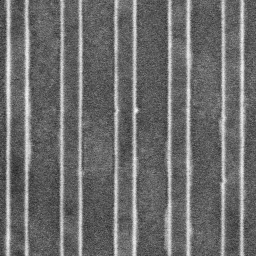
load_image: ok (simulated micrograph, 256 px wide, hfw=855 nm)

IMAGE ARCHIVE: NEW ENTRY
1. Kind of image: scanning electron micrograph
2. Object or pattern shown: parallel lines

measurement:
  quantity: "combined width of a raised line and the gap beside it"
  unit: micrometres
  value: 0.179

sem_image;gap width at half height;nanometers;113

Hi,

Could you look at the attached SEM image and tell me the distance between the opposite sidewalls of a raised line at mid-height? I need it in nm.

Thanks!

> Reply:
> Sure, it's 64.6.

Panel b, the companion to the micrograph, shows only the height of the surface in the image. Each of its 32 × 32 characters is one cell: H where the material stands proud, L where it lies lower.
LHHLLLLLHHLLLLHHHLLLLHHHLLLLHHLL
LHHLLLLLHHLLLLHHHLLLLHHHLLLLHHLL
LHHLLLLLHHLLLLHHHLLLLHHHLLLLHHLL
LHHLLLLLHHLLLLHHHLLLLHHHLLLLHHLL
LHHLLLLLHHLLLLHHHLLLLHHHLLLLHHLL
LHHLLLLLHHLLLLHHHLLLLHHHLLLLHHLL
LHHLLLLLHHLLLLHHHLLLLHHHLLLLHHLL
LHHLLLLLHHLLLLHHHLLLLHHHLLLLHHLL
LHHLLLLLHHLLLLHHHLLLLHHHLLLLHHLL
LHHLLLLLHHLLLLHHHLLLLHHHLLLLHHLL
LHHLLLLLHHLLLLHHHLLLLHHHLLLLHHLL
LHHLLLLLHHLLLLHHHLLLLHHHLLLLHHLL
LHHLLLLLHHLLLLHHHLLLLHHHLLLLHHLL
LHHLLLLLHHLLLLHHHLLLLHHHLLLLHHLL
LHHLLLLLHHLLLLHHHLLLLHHHLLLLHHLL
LHHLLLLLHHLLLLLHHLLLLHHHLLLLHHLL
LHHLLLLLHHLLLLLHHLLLLHHHLLLLHHLL
LHHLLLLLHHLLLLHHHLLLLHHHLLLLHHLL
LHHLLLLLHHLLLLHHHLLLLHHHLLLLHHLL
LHHLLLLLHHLLHHHHHLLLLHHHLLLLHHLL
LHHLLLLLHHLHHHHHHLLLLHHHLLLLHHLL
LHHLLLLLHHLLLLHHHLLLLHHHLLLLHHLL
LHHLLLLLHHLLLLHHHLLLLHHHLLLLHHLL
LHHLLLLLHHLLLLHHHLLLLHHHLLLLHHLL
LHHLLLLLHHLLLLHHHLLLLHHHLLLLHHLL
LHHLLLLLHHLLLLHHHLLLLHHHLLLLHHLL
LHHLLLLLHHLLLLHHHLLLLHHHLLLLHHLL
LHHLLLLLHHLLLLHHHLLLLHHHLLLLHHLL
LHHLLLLLHHLLLLHHHLLLLHHHLLLLHHLL
LHHLLLLLHHLLLLHHHLLLLHHHLLLLHHLL
LHHLLLLLHHLLLLHHHLLLLHHHLLLLHHLL
LHHLLLLLHHLLLLHHHLLLLHHHLLLLHHLL